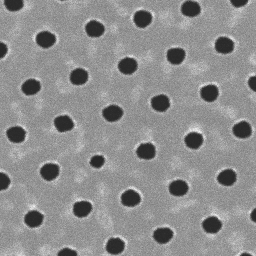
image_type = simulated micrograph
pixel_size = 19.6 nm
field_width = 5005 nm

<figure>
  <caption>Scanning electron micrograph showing a regular array of holes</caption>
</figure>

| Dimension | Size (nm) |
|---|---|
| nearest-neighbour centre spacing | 959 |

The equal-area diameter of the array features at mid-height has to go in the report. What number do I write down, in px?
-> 19.2